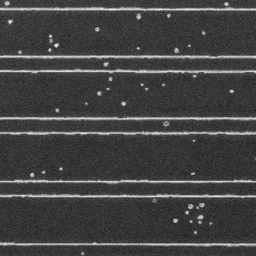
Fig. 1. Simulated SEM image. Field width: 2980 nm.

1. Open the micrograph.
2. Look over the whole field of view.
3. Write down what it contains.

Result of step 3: lines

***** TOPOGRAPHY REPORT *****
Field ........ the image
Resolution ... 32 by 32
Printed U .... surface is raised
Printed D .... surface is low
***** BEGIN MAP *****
UUUUUUUUUUUUUUUUUUUUUUUUUUUUUUUU
DDDDDDDDDDDDDDDDDDDDDDDDDDDDDDDD
DDDDDDDDDDDDDDDDDDDDDDDDDDDDDDDD
DDDDDDDDDDDDDDDDDDDDDDDDDDDDDDDD
DDDDDDDDDDDDDDDDDDDDDDDDDDDDDDDD
DDDDDDDDDDDDDDDDDDDDDDDDDDDDDDDD
DDDDDDDDDDDDDDDDDDDDDDDDDDDDDDDD
UUUUUUUUUUUUUUUUUUUUUUUUUUUUUUUU
UUUUUUUUUUUUUUUUUUUUUUUUUUUUUUUU
DDDDDDDDDDDDDDDDDDDDDDDDDDDDDDDD
DDDDDDDDDDDDDDDDDDDDDDDDDDDDDDDD
DDDDDDDDDDDDDDDDDDDDDDDDDDDDDDDD
DDDDDDDDDDDDDDDDDDDDDDDDDDDDDDDD
DDDDDDDDDDDDDDDDDDDDDDDDDDDDDDDD
DDDDDDDDDDDDDDDDDDDDDDDDDDDDDDDD
UUUUUUUUUUUUUUUUUUUUUUUUUUUUUUUU
UUUUUUUUUUUUUUUUUUUUUUUUUUUUUUUU
DDDDDDDDDDDDDDDDDDDDDDDDDDDDDDDD
DDDDDDDDDDDDDDDDDDDDDDDDDDDDDDDD
DDDDDDDDDDDDDDDDDDDDDDDDDDDDDDDD
DDDDDDDDDDDDDDDDDDDDDDDDDDDDDDDD
DDDDDDDDDDDDDDDDDDDDDDDDDDDDDDDD
DDDDDDDDDDDDDDDDDDDDDDDDDDDDDDDD
UUUUUUUUUUUUUUUUUUUUUUUUUUUUUUUU
UDDUUUUUUUUUUUUUUUUUUUUUUUUUUUUU
DDDDDDDDDDDDDDDDDDDDDDDDDDDDDDDD
DDDDDDDDDDDDDDDDDDDDDDDDDDDDDDDD
DDDDDDDDDDDDDDDDDDDDDDDDDDDDDDDD
DDDDDDDDDDDDDDDDDDDDDDDDDDDDDDDD
DDDDDDDDDDDDDDDDDDDDDDDDDDDDDDDD
UDDDDDDDDDDDDDDDDDDDDDDDDDDDDDDD
UUUUUUUUUUUUUUUUUUUUUUUUUUUUUUUU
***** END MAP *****